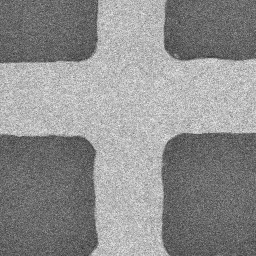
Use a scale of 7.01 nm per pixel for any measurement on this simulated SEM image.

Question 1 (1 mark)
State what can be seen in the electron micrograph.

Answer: holes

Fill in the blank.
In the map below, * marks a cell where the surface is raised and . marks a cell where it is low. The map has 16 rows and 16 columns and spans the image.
......****......
......****......
......****......
......*****.....
****************
****************
****************
****************
.....******.....
......****......
......****......
......****......
......****......
......****......
......****......
......****......